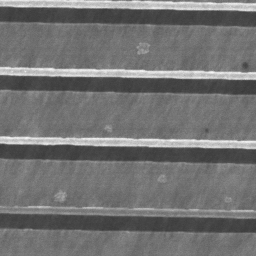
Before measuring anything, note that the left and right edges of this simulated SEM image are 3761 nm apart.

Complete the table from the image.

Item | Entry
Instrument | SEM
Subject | lines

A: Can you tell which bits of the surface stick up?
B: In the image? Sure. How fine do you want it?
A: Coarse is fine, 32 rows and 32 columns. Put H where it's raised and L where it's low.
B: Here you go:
HHHHHHHHHHHHHHHHHHHHHHHHHHHHHHHH
LLLLLLLLLLLLLLLLLLLLLLLLLLLLLLLL
LLLLLLLLLLLLLLLLLLLLLLLLLLLLLLLL
HHHHHHHHHHHHHHHHHHHHHHHHHHHHHHHH
HHHHHHHHHHHHHHHHHHHHHHHHHHHHHHHH
HHHHHHHHHHHHHHHHHHHHHHHHHHHHHHHH
HHHHHHHHHHHHHHHHHHHHHHHHHHHHHHHH
HHHHHHHHHHHHHHHHHHHHHHHHHHHHHHHH
HHHHHHHHHHHHHHHHHHHHHHHHHHHHHHHH
LLLLLLHHHHHHHHHHHHHHHHHHHHHHHHHH
LLLLLLLLLLLLLLLLLLLLLLLLLLLLLLLL
HHHHHHHHHHLLLLLLLLLLLLLLLLLLLLLL
HHHHHHHHHHHHHHHHHHHHHHHHHHHHHHHH
HHHHHHHHHHHHHHHHHHHHHHHHHHHHHHHH
HHHHHHHHHHHHHHHHHHHHHHHHHHHHHHHH
HHHHHHHHHHHHHHHHHHHHHHHHHHHHHHHH
HHHHHHHHHHHHHHHHHHHHHHHHHHHHHHHH
HHHHHHHHHHHHHHHHHHHHHHHHHHHHHHHH
LLLLLLLLLLLLLLLLLLLLLLLLLLLLLLHH
LLLLLLLLLLLLLLLLLLLLLLLLLLLLLLLL
HHHHHHHHHHHHHHHHHHHHHHHHHHHHHHLL
HHHHHHHHHHHHHHHHHHHHHHHHHHHHHHHH
HHHHHHHHHHHHHHHHHHHHHHHHHHHHHHHH
HHHHHHHHHHHHHHHHHHHHHHHHHHHHHHHH
HHHHHHHHHHHHHHHHHHHHHHHHHHHHHHHH
HHHHHHHHHHHHHHHHHHHHHHHHHHHHHHHH
HHHHHHHHHHHHHHHHHHHHHHHHHHHHHHHH
LLLLLLLLLLLLLLLLLLLLLLLLLLLLLLLL
LLLLLLLLLLLLLLLLLLLLLLLLLLLLLLLL
HHHHHHHHHHHHHHHHHHHHHHHHHHHHHHHH
HHHHHHHHHHHHHHHHHHHHHHHHHHHHHHHH
HHHHHHHHHHHHHHHHHHHHHHHHHHHHHHHH